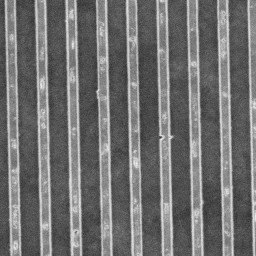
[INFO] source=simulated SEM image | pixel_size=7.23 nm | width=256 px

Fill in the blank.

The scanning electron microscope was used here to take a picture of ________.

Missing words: parallel lines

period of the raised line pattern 0.219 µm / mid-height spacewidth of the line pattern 154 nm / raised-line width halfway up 70.5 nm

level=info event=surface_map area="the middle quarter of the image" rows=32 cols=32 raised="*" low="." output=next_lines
.**......**.....**......**.....*
.**......**.....**......**.....*
.**......**.....**......**.....*
.**......**.....**......**.....*
.**......**.....**......**.....*
.**......**.....**......**.....*
.**......**.....**......**.....*
.**.....***.....**......**.....*
.**......**.....**......**.....*
.**......**.....**......**......
.**......**.....**......**......
.**......**.....**......**......
.**......**......*......**......
.**......**......**.....**......
.**......**......**.....**......
.**......**......**.....**......
.***.....**......**.....**......
.***.....**......**.....**......
.***.....**......**......**.....
.***.....**......**.....**......
.***.....**......**.....**......
.***.....**......**.....**......
.***.....**......**.....**......
.***.....**......**.....**......
.***.....**......**.....***.....
..**.....**......**.....***.....
..**.....**......**.....***.....
..**.....**......**.....***.....
..**.....**......**.....***.....
..**.....**......**.....***.....
..**.....**......**.....***.....
..**.....**......**.....***.....